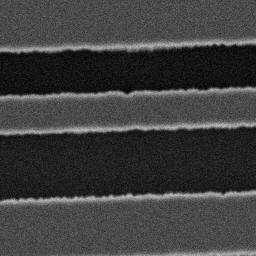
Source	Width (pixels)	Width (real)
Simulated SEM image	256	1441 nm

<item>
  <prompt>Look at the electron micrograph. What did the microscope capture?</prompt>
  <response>lines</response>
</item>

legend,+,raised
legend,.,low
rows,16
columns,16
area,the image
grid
++++++++++++++++
++++++++++++++++
++++++++++++++++
................
................
................
++++++++++++++++
++++++++++++++++
................
................
................
................
.+++++++++++++++
++++++++++++++++
++++++++++++++++
++++++++++++++++